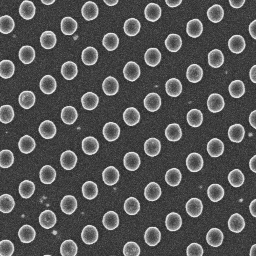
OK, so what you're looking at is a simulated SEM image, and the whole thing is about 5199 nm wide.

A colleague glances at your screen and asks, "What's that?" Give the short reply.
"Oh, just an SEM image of a regular array of raised bodies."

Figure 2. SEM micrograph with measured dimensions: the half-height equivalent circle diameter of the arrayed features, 0.342 micrometres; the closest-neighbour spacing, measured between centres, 516 nanometers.